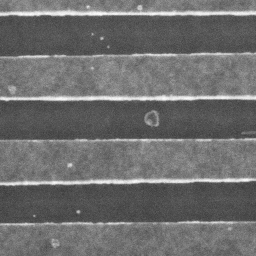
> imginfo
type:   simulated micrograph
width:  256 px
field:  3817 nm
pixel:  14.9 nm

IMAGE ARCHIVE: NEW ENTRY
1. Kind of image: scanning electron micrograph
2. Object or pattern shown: lines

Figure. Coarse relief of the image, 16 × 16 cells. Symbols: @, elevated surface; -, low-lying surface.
@@@@@@@@@@@@@@@@
----------------
----------------
------@@@@@@@@@@
@@@@@@@@@@@@@@@@
@@@@@@@@@@@@@@@@
----------------
----------------
----------------
@@@@@@@@@@@@@@@@
@@@@@@@@@@@@@@@@
@---------------
----------------
----------------
@@@@@@@@@@@@@@@@
@@@@@@@@@@@@@@@@